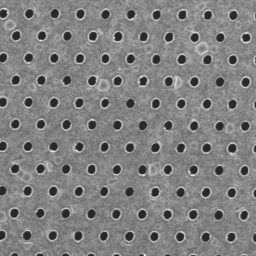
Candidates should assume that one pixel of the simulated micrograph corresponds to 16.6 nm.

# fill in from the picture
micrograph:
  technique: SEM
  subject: a regular array of holes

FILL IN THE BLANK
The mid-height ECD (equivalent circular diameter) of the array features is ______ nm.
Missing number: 148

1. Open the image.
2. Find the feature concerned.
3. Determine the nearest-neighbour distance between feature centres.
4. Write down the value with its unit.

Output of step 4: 420 nm